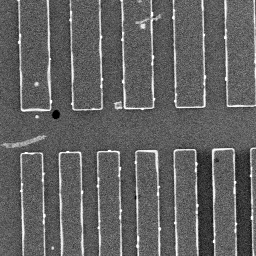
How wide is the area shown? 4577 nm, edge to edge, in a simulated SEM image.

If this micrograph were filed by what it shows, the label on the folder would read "groups of lines, slits or small figures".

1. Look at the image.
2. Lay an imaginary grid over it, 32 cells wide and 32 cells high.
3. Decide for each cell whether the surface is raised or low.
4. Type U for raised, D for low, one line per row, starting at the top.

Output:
DDUUUUDDDUUUDDDUUUUDDDUUUDDDUUUU
DDUUUUDDDUUUDDDUUUUDDDUUUDDDUUUU
DDUUUUDDDUUUUDDUUUUDDDUUUDDDUUUU
DDDUUUDDDUUUUDDUUUUDDDUUUDDDUUUU
DDDUUUDDDUUUUDDUUUUDDDUUUDDDUUUU
DDDUUUDDDUUUUDDUUUUDDDUUUDDDUUUU
DDDUUUDDDUUUUDDUUUUDDDUUUDDDUUUU
DDDUUUDDDUUUUDDUUUUDDDUUUUDDUUUU
DDDUUUDDDUUUUDDUUUUDDDUUUUDDUUUU
DDDUUUDDDUUUUDDUUUUDDDUUUUDDUUUU
DDDUUUDDDUUUUDDUUUUDDDUUUUDDUUUU
DDDUUUDDDUUUUDDUUUUDDDUUUUDDUUUU
DDDUUUDDDUUUUDDUUUUDDDUUUUDDUUUU
DDDUUUDDDUUUUDDDUUUDDDDDDDDDDDDD
DDDDDDDDDDDDDDDDDDDDDDDDDDDDDDDD
DDDDDDDDDDDDDDDDDDDDDDDDDDDDDDDD
DDDDDDDDDDDDDDDDDDDDDDDDDDDDDDDD
DDDDDDDDDDDDDDDDDDDDDDDDDDDDDDDD
DDDDDDDDDDDDDDDDDDDDDDDDDDDDDDDD
DDDUUDDUUUDDUUUDDUUUDDUUDDDUUDDU
DDDUUDDUUUDDUUUDDUUUDDUUDDDUUDDU
DDDUUDDUUUDDUUUDDUUUDDUUDDDUUDDU
DDDUUDDUUUDDUUUDDUUUDDUUDDDUUDDU
DDDUUDDDUUDDUUUDDUUUDDUUDDDUUDDU
DDDUUDDDUUDDUUUDDUUUDDUUUDDUUDDU
DDDUUDDDUUDDUUUDDUUUDDUUUDDUUDDD
DDDUUDDDUUDDUUUDDUUUDDUUUDDUUDDD
DDDUUDDDUUDDUUUDDUUUDDUUUDDUUDDD
DDDUUDDDUUDDUUUDDUUUDDUUUDDUUDDD
DDDUUUDDUUDDUUUDDUUUDDUUUDDUUDDD
DDDUUUDDUUDDDUUDDUUUDDUUUDDUUUDD
DDDUUUDDUUDDDUUDDUUUDDUUUDDUUUDD